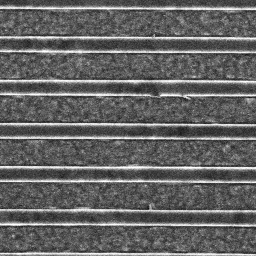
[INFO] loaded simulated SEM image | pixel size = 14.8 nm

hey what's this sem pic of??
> parallel lines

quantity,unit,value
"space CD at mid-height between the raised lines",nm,415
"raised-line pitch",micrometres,0.637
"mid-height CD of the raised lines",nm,221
